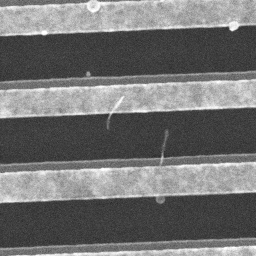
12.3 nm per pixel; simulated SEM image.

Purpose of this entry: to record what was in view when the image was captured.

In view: lines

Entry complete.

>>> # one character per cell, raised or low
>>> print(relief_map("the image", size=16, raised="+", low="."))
++++++++++++++++
++++++++++++++++
................
................
................
++++++++++++++++
++++++++++++++++
................
................
................
++++++++++++++++
++++++++++++++++
+++.............
................
................
.+++++++++++++++